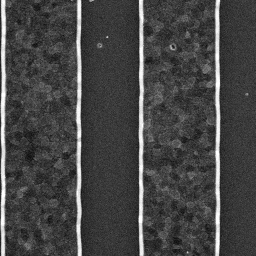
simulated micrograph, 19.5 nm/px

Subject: wiring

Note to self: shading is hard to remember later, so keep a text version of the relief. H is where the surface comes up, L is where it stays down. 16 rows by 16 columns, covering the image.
HHHHHLLLLHHHHHLL
HHHHHLLLLHHHHHLL
HHHHHLLLLHHHHHLL
HHHHHLLLLHHHHHLL
HHHHHLLLLHHHHHLL
HHHHHLLLLHHHHHLL
HHHHHLLLLHHHHHLL
HHHHHLLLLHHHHHLL
HHHHHLLLLHHHHHLL
HHHHHLLLLHHHHHLL
HHHHHLLLLHHHHHLL
HHHHHLLLLHHHHHLL
HHHHHLLLLHHHHHLL
HHHHHLLLLHHHHHLL
HHHHHLLLLHHHHHLL
HHHHHLLLLHHHHHLL